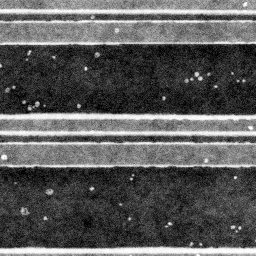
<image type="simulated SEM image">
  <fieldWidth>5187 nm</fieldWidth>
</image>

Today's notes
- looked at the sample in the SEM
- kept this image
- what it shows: lines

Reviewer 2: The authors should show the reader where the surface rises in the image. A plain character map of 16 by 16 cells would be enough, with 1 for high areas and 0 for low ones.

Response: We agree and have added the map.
1111111111111111
1111111111111111
1111111111111111
0000000000000000
0000000000000000
0000000000000000
0000000000000000
1111111111111111
1111111111111111
1111111111111111
0000000000000000
0000000000000000
0000000000000000
0000000000000000
0000000000000000
0000000000000000